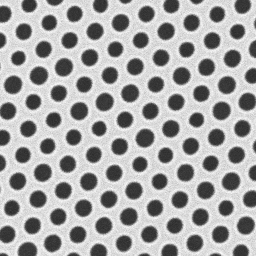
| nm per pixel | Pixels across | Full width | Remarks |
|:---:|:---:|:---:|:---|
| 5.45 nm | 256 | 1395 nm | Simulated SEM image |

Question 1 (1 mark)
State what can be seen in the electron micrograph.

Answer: a regular array of holes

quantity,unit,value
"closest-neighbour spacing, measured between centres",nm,145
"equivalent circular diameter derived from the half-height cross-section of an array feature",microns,0.0953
